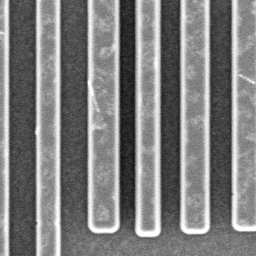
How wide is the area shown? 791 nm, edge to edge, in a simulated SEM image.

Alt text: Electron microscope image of parallel lines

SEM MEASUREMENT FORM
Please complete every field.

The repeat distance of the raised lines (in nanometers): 151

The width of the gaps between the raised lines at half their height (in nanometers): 77.9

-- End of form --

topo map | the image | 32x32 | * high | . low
*....**....****..***...***...***
*....**....****..***...***...***
*....**....****..***...***...***
*....**....****..***...***...***
*....**....****..***...***...***
*....**....****..***...***...***
*....**....****..***...***...***
*....**....****..***...***...***
*....**....****..***...***...***
*....**....****..***...***...***
*....**....****..***...***...***
*....**....****..***...***...***
*....**....****..***...***...***
*....**....****..***...***...***
*....**....****..***...***...***
*....**....****..***...***...***
*....**....****..***...***...***
*....**....****..***...***...***
*....**....****..***...***...***
*....**....****..***...***...***
*....**....****..***...***...***
*....**....****..***...***...***
*....**....****..***...***...***
*....**....****..***...***...***
*....**....****..***...***...***
*....**....****..***...***...***
*....**....****..***...***...***
*....**....****..***...***...***
*....**....****..***...***....**
*....**.........................
*....**.........................
*....**.........................